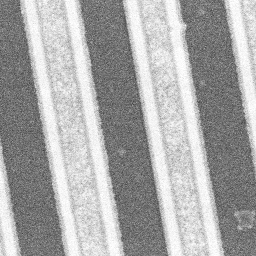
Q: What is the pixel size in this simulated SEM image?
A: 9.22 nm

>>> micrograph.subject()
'one or a few lines or trenches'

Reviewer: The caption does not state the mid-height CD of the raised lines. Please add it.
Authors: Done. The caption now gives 0.356 µm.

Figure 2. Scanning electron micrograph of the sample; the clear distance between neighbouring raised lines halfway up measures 570 nanometres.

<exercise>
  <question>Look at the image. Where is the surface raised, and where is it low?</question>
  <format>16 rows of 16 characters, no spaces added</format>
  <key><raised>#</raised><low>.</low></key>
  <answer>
..##....###....#
..###....##....#
..###....##....#
..###....##....#
...##....##....#
...##....###....
...##....###....
...###....##....
...###....##....
....##....##....
....##....##....
....##....###...
....###...###...
....###....##...
....###....##...
#....##....##...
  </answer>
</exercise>